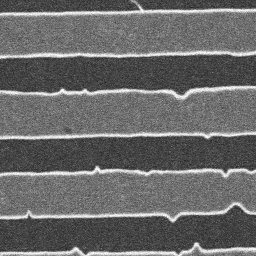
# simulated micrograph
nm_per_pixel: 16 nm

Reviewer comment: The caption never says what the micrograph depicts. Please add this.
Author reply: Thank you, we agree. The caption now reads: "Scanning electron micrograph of one or a few lines or trenches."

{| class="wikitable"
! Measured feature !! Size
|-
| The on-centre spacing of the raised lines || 1280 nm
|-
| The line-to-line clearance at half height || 0.578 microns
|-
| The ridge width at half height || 696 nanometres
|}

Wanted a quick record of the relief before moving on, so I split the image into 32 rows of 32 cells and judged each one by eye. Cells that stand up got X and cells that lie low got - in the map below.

--------------------------------
----------------XXXXXXXXXXXXXXXX
XXXXXXXXXXXXXXXXXXXXXXXXXXXXXXXX
XXXXXXXXXXXXXXXXXXXXXXXXXXXXXXXX
XXXXXXXXXXXXXXXXXXXXXXXXXXXXXXXX
XXXXXXXXXXXXXXXXXXXXXXXXXXXXXXXX
XXXXXXXXXXXXXXXXXXXXXXXXXXXXXXXX
--------------------------------
--------------------------------
--------------------------------
--------------------------------
X---------X--XXXXXXXX---XXXXXXXX
XXXXXXXXXXXXXXXXXXXXXXXXXXXXXXXX
XXXXXXXXXXXXXXXXXXXXXXXXXXXXXXXX
XXXXXXXXXXXXXXXXXXXXXXXXXXXXXXXX
XXXXXXXXXXXXXXXXXXXXXXXXXXXXXXXX
XXXXXXXXXXXXXXXXXXXXXXXXXXXXXXXX
--------------------------------
--------------------------------
--------------------------------
--------------------------------
-----------XXXXXXX-XXX-XXXXX-XX-
XXXXXXXXXXXXXXXXXXXXXXXXXXXXXXXX
XXXXXXXXXXXXXXXXXXXXXXXXXXXXXXXX
XXXXXXXXXXXXXXXXXXXXXXXXXXXXXXXX
XXXXXXXXXXXXXXXXXXXXXXXXXXXXXXXX
XXXXXXXXXXXXXXXXXXXXXXXXXXXX---X
--------------------------------
--------------------------------
--------------------------------
--------------------------------
---------X-------------XXXXXXXXX